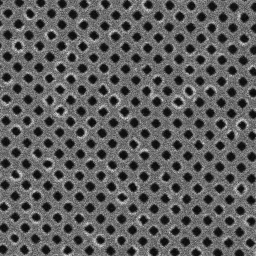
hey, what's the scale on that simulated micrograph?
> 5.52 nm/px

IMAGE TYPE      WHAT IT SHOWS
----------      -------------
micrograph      a regular array of holes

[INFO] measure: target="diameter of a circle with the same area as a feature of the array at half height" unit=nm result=49.4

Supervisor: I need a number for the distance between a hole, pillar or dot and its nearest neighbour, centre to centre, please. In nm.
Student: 81.8